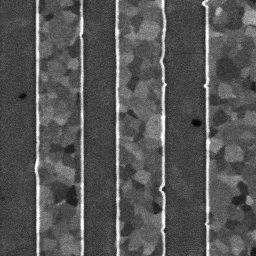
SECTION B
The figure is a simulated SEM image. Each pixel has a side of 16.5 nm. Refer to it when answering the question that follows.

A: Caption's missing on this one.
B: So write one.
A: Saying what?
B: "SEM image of one or a few lines or trenches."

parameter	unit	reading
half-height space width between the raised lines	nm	614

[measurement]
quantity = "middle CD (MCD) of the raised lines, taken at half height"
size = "758 nm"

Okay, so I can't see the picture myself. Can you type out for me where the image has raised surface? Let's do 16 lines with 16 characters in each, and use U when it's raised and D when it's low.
DDUUUDDUUUDDDUUU
DDUUUDDUUUDDDUUU
DDUUUDDUUUDDDUUU
DDUUUDDUUUDDDUUU
DDUUUDDUUUDDDUUU
DDUUUDDUUUDDDUUU
DDUUUDDUUUDDDUUU
DDUUUDDUUUDDDUUU
DDUUUDDUUUDDDUUU
DDUUUDDUUUDDDUUU
DDUUUDDUUUDDDUUU
DDUUUDDUUUDDDUUU
DDUUUDDUUUDDDUUU
DDUUUDDUUUDDDUUU
DDUUUDDUUUDDDUUU
DDUUUDDUUUDDDUUU